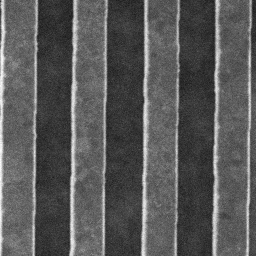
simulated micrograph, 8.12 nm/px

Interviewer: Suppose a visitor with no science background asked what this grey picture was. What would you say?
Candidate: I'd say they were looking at lines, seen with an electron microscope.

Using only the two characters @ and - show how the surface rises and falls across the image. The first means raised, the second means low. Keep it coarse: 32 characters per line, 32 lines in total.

@@@@@----@@@@-----@@@@-----@@@@-
@@@@@----@@@@-----@@@@-----@@@@-
@@@@@----@@@@-----@@@@-----@@@@-
@@@@-----@@@@-----@@@@-----@@@@-
@@@@-----@@@@-----@@@@-----@@@@-
@@@@-----@@@@-----@@@@-----@@@@-
@@@@-----@@@@-----@@@@-----@@@@-
@@@@-----@@@@-----@@@@-----@@@@-
@@@@-----@@@@-----@@@@-----@@@@-
@@@@-----@@@@-----@@@@-----@@@@-
@@@@-----@@@@-----@@@@-----@@@@-
@@@@-----@@@@-----@@@@-----@@@@-
@@@@-----@@@@-----@@@@-----@@@@-
@@@@-----@@@@-----@@@@-----@@@@-
@@@@-----@@@@-----@@@@-----@@@@-
@@@@-----@@@@-----@@@@-----@@@@-
@@@@-----@@@@-----@@@@-----@@@@-
@@@@-----@@@@-----@@@@-----@@@@-
@@@@-----@@@@-----@@@@-----@@@@-
@@@@-----@@@@-----@@@@-----@@@@-
@@@@-----@@@@-----@@@@-----@@@@-
@@@@-----@@@@-----@@@@-----@@@@-
@@@@-----@@@@-----@@@@-----@@@@-
@@@@-----@@@@-----@@@@-----@@@@-
@@@@-----@@@@-----@@@@-----@@@@-
@@@@-----@@@@-----@@@@-----@@@@-
@@@@-----@@@@-----@@@@-----@@@@-
@@@@-----@@@@-----@@@@-----@@@@-
@@@@-----@@@@-----@@@@-----@@@@-
@@@@-----@@@@-----@@@@-----@@@@-
@@@@-----@@@@-----@@@@-----@@@@-
@@@@-----@@@@-----@@@@-----@@@@-